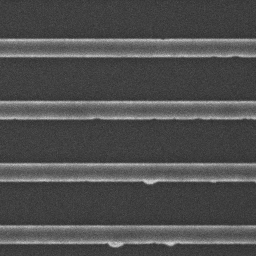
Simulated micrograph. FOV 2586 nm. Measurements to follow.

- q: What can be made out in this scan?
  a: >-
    lines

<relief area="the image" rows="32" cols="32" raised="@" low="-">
--------------------------------
--------------------------------
--------------------------------
--------------------------------
--------------------------------
@@@@@@@@@@@@@@@@@@@@@@@@@@@@@@@@
@@@@@@@@@@@@@@@@@@@@@@@@@@@@@@@@
--------------------------------
--------------------------------
--------------------------------
--------------------------------
--------------------------------
--------------------------------
@@@@@@@@@@@@@@@@@@@@@@@@@@@@@@@@
@@@@@@@@@@@@@@@@@@@@@@@@@@@@@@@@
--------------------------------
--------------------------------
--------------------------------
--------------------------------
--------------------------------
--------------------------------
@@@@@@@@@@@@@@@@@@@@@@@@@@@@@@@@
@@@@@@@@@@@@@@@@@@@@@@@@@@@@@@@@
--------------------------------
--------------------------------
--------------------------------
--------------------------------
--------------------------------
@@@@@@@@@@@@@@@@@@@@@@@@@@@@@@@@
@@@@@@@@@@@@@@@@@@@@@@@@@@@@@@@@
--------------------------------
--------------------------------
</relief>